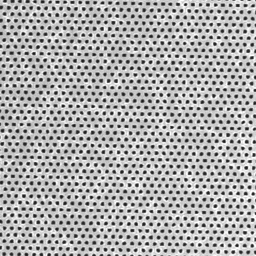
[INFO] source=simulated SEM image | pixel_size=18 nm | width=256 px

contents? a regular array of holes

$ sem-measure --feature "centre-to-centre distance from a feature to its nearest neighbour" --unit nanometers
130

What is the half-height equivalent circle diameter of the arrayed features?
0.081 micrometres